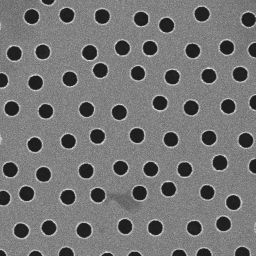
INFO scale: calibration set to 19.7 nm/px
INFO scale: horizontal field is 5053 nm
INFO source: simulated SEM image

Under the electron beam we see a regular array of holes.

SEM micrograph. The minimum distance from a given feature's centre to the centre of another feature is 572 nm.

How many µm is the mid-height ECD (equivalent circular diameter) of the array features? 0.295